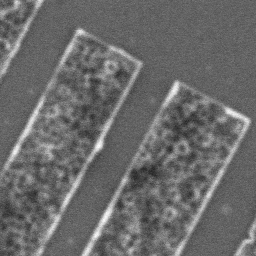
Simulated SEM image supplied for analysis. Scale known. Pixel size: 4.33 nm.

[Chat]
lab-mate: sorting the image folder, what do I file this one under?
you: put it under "one or a few lines or trenches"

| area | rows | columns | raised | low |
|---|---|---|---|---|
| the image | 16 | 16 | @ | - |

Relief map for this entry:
@@--------------
@@--------------
@----@----------
@---@@@@--------
----@@@@@-------
---@@@@@---@----
--@@@@@---@@@@--
--@@@@@---@@@@@-
-@@@@@@--@@@@@@-
-@@@@@---@@@@@@-
@@@@@---@@@@@@--
@@@@@---@@@@@---
@@@@---@@@@@@---
@@@@---@@@@@----
@@@---@@@@@@----
@@@--@@@@@@----@